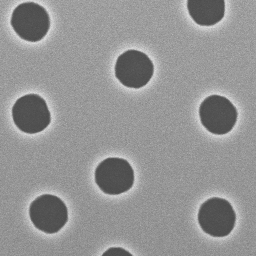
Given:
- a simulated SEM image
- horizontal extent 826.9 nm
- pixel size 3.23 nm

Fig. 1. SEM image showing holes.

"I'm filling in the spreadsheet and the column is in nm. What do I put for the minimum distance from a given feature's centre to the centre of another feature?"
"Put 298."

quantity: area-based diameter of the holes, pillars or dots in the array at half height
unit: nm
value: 123